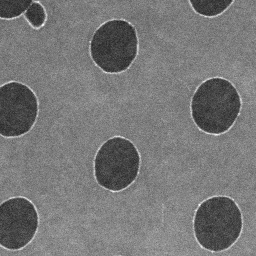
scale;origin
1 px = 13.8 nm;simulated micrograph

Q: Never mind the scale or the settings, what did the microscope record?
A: raised bodies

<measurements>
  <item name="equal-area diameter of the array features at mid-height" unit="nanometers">716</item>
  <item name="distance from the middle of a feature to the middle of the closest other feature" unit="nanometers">1610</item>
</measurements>